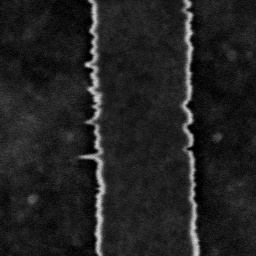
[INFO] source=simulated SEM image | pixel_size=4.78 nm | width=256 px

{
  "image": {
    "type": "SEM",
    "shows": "one or a few lines or trenches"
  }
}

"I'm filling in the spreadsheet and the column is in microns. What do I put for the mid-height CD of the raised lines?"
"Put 0.456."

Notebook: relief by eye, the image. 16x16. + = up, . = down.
......++++++....
......++++++....
......++++++....
......++++++....
......++++++....
......++++++....
......++++++....
......++++++....
......++++++....
......++++++....
......++++++....
......++++++....
......++++++....
......++++++....
......++++++....
......++++++....